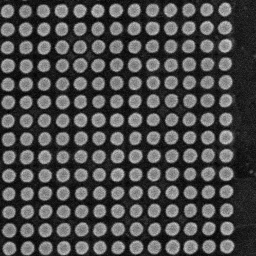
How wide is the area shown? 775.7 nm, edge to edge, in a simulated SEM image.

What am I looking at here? a regular array of raised bodies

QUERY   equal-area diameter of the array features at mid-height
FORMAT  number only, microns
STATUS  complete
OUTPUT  0.0394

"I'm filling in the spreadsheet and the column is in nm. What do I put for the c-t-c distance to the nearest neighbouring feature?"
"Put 54.3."